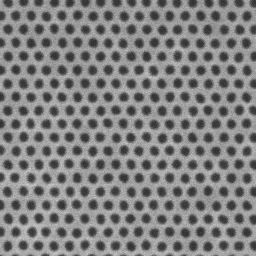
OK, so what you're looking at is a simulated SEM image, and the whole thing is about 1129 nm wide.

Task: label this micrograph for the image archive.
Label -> a regular array of holes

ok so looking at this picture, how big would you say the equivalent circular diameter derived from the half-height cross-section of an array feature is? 44 nm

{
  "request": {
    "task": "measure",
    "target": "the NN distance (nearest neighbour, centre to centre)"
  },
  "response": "65.3 nanometres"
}